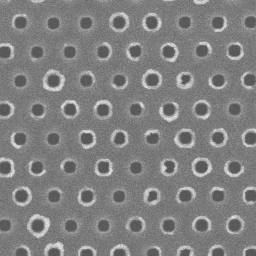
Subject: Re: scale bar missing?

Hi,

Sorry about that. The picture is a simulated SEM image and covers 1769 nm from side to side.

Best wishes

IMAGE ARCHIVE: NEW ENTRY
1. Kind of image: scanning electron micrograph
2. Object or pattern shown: a regular array of holes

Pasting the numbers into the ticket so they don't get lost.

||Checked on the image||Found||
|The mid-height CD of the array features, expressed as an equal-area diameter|81.4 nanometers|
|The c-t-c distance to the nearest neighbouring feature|0.226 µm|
